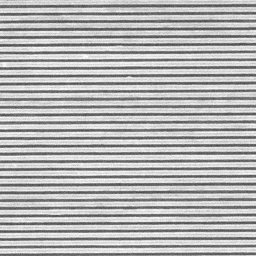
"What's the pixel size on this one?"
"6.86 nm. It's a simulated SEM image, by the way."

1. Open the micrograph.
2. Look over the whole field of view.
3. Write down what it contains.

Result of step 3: parallel lines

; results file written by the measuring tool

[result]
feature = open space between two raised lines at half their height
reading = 0.0266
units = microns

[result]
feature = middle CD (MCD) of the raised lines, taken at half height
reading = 27.4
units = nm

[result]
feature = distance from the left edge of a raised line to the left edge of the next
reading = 53.3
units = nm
